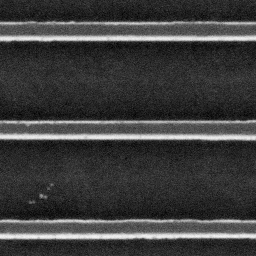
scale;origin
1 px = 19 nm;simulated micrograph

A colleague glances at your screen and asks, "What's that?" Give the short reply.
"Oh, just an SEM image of lines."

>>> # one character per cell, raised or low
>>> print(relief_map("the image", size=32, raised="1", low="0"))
00000000000000000000000000000000
00000000000000000000000000000000
00000000000000000000000000000000
11111111111111111111111111111111
11111111111111111111111111111111
00000000000000000000000000000000
00000000000000000000000000000000
00000000000000000000000000000000
00000000000000000000000000000000
00000000000000000000000000000000
00000000000000000000000000000000
00000000000000000000000000000000
00000000000000000000000000000000
00000000000000000000000000000000
00000000000000000000000000000000
11111111111111111111111111111111
11111111111111111111111111111111
00000000000000000000000000000000
00000000000000000000000000000000
00000000000000000000000000000000
00000000000000000000000000000000
00000000000000000000000000000000
00000000000000000000000000000000
00000000000000000000000000000000
00000000000000000000000000000000
00000000000000000000000000000000
00000000000000000000000000000000
00000000000000000000000000000000
11111111111111111111111111111111
11111111111111111111111111111111
00000000000000000000000000000000
00000000000000000000000000000000